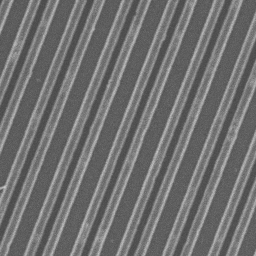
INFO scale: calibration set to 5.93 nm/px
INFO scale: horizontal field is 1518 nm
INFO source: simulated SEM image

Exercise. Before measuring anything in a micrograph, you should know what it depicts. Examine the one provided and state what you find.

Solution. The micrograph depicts parallel lines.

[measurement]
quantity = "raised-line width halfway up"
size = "51.2 nm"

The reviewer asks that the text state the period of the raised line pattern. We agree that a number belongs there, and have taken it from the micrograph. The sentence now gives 126 nanometres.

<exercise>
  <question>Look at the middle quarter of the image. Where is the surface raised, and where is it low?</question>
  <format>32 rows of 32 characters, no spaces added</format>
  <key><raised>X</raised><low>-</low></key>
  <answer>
-XXX----XXX--XX-----XX--XXX-----
-XX-----XX---XX-----XX--XX-----X
-XX-----XX--XX-----XX---XX-----X
XX-----XX---XX-----XX--XXX----XX
XX-----XX--XXX----XXX--XX-----XX
XX----XXX--XX-----XX---XX----XXX
X-----XX---XX-----XX--XX-----XX-
X-----XX--XXX----XXX--XX-----XX-
X----XXX--XX-----XX--XXX----XXX-
-----XX---XX-----XX--XX-----XX--
----XXX--XX-----XX---XX-----XX--
----XX---XX-----XX--XX-----XX---
----XX--XX-----XXX--XX-----XX--X
---XXX--XX-----XX--XXX----XXX--X
---XX---XX-----XX--XX-----XX---X
---XX--XXX----XX---XX-----XX--XX
--XX---XX-----XX--XXX----XX---XX
--XX--XXX----XXX--XX-----XX--XXX
-XXX--XX-----XX--XXX----XXX--XX-
-XX---XX-----XX--XX-----XX---XX-
-XX--XX-----XXX--XX-----XX--XXX-
XXX--XX-----XX---XX----XXX--XX--
XX---XX-----XX--XX-----XX---XX--
XX--XX-----XX---XX-----XX--XX---
X---XX-----XX--XX-----XX---XX---
X--XXX----XXX--XX-----XX--XXX---
X--XX-----XX--XXX----XXX--XX----
---XX-----XX--XXX----XX---XX----
--XX-----XX---XX-----XX--XXX----
--XX-----XX--XXX----XX---XX-----
-XXX----XXX--XX-----XX--XXX----X
-XX-----XX--XXX----XXX--XX-----X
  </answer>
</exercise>